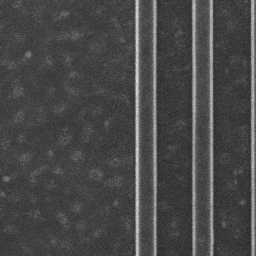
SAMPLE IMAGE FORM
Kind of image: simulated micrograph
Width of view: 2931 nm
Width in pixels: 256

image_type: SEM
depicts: one or a few lines or trenches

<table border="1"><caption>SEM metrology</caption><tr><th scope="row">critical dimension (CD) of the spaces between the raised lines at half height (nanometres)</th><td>451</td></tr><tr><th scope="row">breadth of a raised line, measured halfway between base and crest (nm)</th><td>215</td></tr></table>